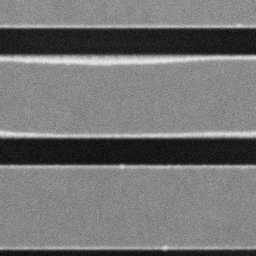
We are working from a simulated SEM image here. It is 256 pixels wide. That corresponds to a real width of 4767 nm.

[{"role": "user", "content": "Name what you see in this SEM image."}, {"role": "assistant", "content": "lines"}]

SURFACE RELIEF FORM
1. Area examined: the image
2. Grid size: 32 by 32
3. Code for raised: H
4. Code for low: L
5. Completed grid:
HHHHHHHHHHHHHHHHHHHHHHHHHHHHHHHH
HHHHHHHHHHHHHHHHHHHHHHHHHHHHHHHH
HHHHHHHHHHHHHHHHHHHHHHHHHHHHHHHH
LLLLLLLLLLLLLLLLLLLLLLLLLLLLLLLL
LLLLLLLLLLLLLLLLLLLLLLLLLLLLLLLL
LLLLLLLLLLLLLLLLLLLLLLLLLLLLLLLL
LLLLLLLLLLLLLLLLLLLLLLLLLLLLLLLL
HHHHHHHHHHHHHHHHHHHHHHHHHHHHHHHH
HHHHHHHHHHHHHHHHHHHHHHHHHHHHHHHH
HHHHHHHHHHHHHHHHHHHHHHHHHHHHHHHH
HHHHHHHHHHHHHHHHHHHHHHHHHHHHHHHH
HHHHHHHHHHHHHHHHHHHHHHHHHHHHHHHH
HHHHHHHHHHHHHHHHHHHHHHHHHHHHHHHH
HHHHHHHHHHHHHHHHHHHHHHHHHHHHHHHH
HHHHHHHHHHHHHHHHHHHHHHHHHHHHHHHH
HHHHHHHHHHHHHHHHHHHHHHHHHHHHHHHH
HHHHHHHHHHHHHHHHHHHHHHHHHHHHHHHH
LLLLLLLLLLLLLLLLLLLLLLLLLLLLLLLL
LLLLLLLLLLLLLLLLLLLLLLLLLLLLLLLL
LLLLLLLLLLLLLLLLLLLLLLLLLLLLLLLL
LLLLLLLLLLLLLLLLLLLLLLLLLLLLLLLL
HHHHHHHHHHHHHHHHHHHHHHHHHHHHHHHH
HHHHHHHHHHHHHHHHHHHHHHHHHHHHHHHH
HHHHHHHHHHHHHHHHHHHHHHHHHHHHHHHH
HHHHHHHHHHHHHHHHHHHHHHHHHHHHHHHH
HHHHHHHHHHHHHHHHHHHHHHHHHHHHHHHH
HHHHHHHHHHHHHHHHHHHHHHHHHHHHHHHH
HHHHHHHHHHHHHHHHHHHHHHHHHHHHHHHH
HHHHHHHHHHHHHHHHHHHHHHHHHHHHHHHH
HHHHHHHHHHHHHHHHHHHHHHHHHHHHHHHH
HHHHHHHHHHHHHHHHHHHHHHHHHHHHHHHH
LLLLLLLLLLLLLLLLLLLLLLLLLLLLLLLL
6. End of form